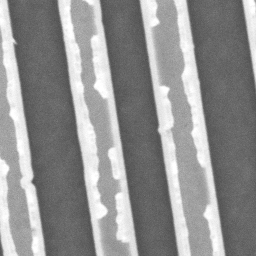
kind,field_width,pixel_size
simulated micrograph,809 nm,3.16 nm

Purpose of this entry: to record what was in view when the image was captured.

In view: one or a few lines or trenches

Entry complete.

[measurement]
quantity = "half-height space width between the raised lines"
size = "174 nm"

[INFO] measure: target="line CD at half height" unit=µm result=0.117